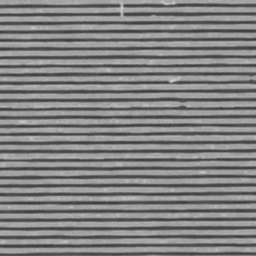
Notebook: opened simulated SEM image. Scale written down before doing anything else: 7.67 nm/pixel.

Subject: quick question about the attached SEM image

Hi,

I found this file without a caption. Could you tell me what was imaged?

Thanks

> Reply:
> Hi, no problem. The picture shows parallel lines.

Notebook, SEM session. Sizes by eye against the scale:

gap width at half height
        22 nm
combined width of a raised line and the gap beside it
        65.7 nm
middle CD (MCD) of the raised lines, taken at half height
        5.5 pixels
